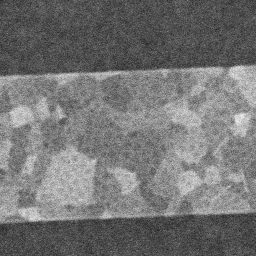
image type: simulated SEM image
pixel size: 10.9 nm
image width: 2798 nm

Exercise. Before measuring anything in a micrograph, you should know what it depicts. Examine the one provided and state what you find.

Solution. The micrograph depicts one or a few lines or trenches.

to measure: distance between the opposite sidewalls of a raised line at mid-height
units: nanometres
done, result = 1560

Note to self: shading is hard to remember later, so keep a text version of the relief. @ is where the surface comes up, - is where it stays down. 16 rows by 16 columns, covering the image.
----------------
----------------
----------------
----------------
----------@@@@@@
@@@@@@@@@@@@@@@@
@@@@@@@@@@@@@@@@
@@@@@@@@@@@@@@@@
@@@@@@@@@@@@@@@@
@@@@@@@@@@@@@@@@
@@@@@@@@@@@@@@@@
@@@@@@@@@@@@@@@@
@@@@@@@@@@@@@@@@
@@@@@@@---------
----------------
----------------